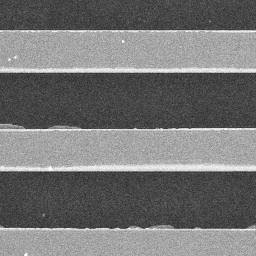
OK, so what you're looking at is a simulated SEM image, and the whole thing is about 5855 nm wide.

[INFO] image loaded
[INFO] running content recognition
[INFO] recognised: lines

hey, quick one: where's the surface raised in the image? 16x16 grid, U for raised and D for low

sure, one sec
DDDDDDDDDDDDDDDD
DDDDDDDDDDDDDDDD
UUUUUUUUUUUUUUUU
UUUUUUUUUUUUUUUU
DDDDDDDDDDDDDDDD
DDDDDDDDDDDDDDDD
DDDDDDDDDDDDDDDD
DDDDDDDDDDDDDDDD
UUUUUUUUUUUUUUUU
UUUUUUUUUUUUUUUU
UUUUUUUUUUUUUUUU
DDDDDDDDDDDDDDDD
DDDDDDDDDDDDDDDD
DDDDDDDDDDDDDDDD
UUUUUUUUUUUUUUUU
UUUUUUUUUUUUUUUU